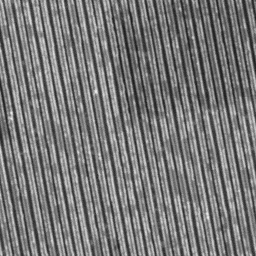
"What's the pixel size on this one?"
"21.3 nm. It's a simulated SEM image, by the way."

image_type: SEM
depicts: parallel lines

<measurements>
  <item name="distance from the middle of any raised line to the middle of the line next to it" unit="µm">0.186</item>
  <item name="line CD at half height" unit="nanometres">102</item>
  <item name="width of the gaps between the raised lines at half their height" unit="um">0.0813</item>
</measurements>